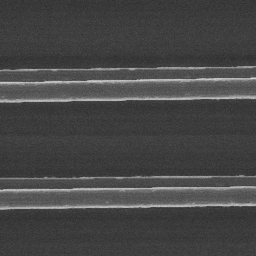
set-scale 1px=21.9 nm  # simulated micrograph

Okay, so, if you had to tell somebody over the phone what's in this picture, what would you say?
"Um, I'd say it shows lines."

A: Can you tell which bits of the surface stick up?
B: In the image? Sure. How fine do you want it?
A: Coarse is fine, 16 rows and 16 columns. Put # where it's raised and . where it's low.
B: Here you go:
................
................
................
................
################
################
................
................
................
................
................
################
################
................
................
................